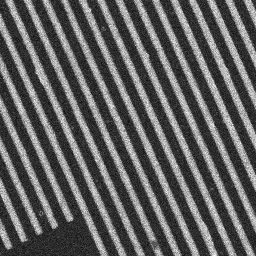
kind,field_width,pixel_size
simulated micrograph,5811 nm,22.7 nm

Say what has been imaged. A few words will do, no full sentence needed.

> parallel lines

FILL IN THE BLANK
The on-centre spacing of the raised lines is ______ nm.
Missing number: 380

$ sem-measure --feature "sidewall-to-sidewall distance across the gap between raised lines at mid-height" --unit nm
130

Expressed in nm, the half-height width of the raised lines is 249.